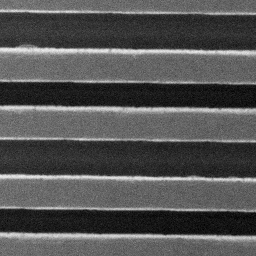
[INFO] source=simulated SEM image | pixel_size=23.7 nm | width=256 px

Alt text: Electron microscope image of lines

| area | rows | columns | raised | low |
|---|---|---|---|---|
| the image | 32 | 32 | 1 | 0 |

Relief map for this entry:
11111111111111111111111111111111
00011111111111111111111111111111
00000000000000000000000000000000
00000000000000000000000000000000
00000000000000000000000000000000
00000000000000000000000000000000
11111111111111111111111111111111
11111111111111111111111111111111
11111111111111111111111111111111
11111111111111111111111111111111
00000000000000000000000000000000
00000000000000000000000000000000
00000000000000000000000000000000
11111111111111111111000000000000
11111111111111111111111111111111
11111111111111111111111111111111
11111111111111111111111111111111
00000000000000001011111111111111
00000000000000000000000000000000
00000000000000000000000000000000
00000000000000000000000000000000
00000000000000000000000000000000
11111111111111111111111111111111
11111111111111111111111111111111
11111111111111111111111111111111
11111111111111111111111111111111
00000000000000000000000000000000
00000000000000000000000000000000
00000000000000000000000000000000
11111111111111111111111110000000
11111111111111111111111111111111
11111111111111111111111111111111